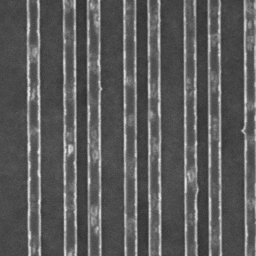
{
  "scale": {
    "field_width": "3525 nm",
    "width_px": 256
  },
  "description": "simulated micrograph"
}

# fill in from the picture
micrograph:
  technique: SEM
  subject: parallel lines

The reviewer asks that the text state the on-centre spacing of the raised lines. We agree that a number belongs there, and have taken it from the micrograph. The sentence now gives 30.1 px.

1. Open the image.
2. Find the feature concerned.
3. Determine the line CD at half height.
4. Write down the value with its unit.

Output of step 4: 174 nm